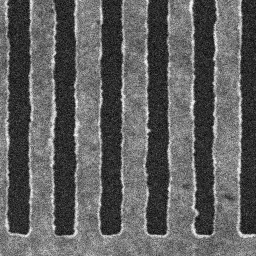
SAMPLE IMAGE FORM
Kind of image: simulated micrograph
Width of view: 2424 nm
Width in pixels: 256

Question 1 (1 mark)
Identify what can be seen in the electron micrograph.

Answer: parallel lines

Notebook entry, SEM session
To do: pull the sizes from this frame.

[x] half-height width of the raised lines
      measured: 234 nanometers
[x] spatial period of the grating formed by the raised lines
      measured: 439 nanometers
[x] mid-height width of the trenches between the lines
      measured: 201 nm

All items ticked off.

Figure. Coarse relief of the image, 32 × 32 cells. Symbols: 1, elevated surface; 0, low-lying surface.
10001110011110011100011100011100
10001110011110011100011100011100
10001110011110011100011100011100
10001110011110011100011100011100
10001110011110011100011100011100
10001110001110011100011100011100
10001110001110011100011100011100
10001110001100011100011100011100
10001110001100011100011100011100
10001110001110011100011100011100
10001110011110011100011100011100
10001110011110011100011100011100
10001110011110011100011100011100
10001110001110011100011100011100
10001110011100011110011100011100
10001110001100011100011100011100
10001110011100011110011100011100
10001110011110011100011100011100
10001110011110011100011100011100
10001110001110011100011100011100
10001110001110011100011100011100
10001110011100011100011100011100
10001110011110011100011100011100
10001110001110011100011100011100
10001110011110011100011100011100
10001110011110011100011100011100
10001110011100011100011110011100
10001110011100011100011100011100
10001110011100011100011100011100
11111111111110111111111111111111
11111111111111111111111111111111
11111111111111111111111111111111